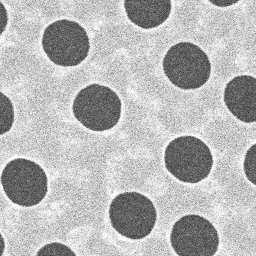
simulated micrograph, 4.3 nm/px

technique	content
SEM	holes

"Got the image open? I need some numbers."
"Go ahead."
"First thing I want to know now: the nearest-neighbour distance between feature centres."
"340 nm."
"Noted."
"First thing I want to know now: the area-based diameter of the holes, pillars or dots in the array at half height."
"48 px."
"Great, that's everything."